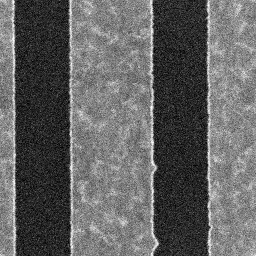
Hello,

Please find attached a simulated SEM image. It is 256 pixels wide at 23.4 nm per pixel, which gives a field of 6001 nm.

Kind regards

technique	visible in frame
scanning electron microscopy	one or a few lines or trenches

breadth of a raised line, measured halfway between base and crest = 1900 nanometers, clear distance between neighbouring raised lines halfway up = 1330 nm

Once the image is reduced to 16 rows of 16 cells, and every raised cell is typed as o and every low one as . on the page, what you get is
o...ooooo....ooo
o...ooooo....ooo
o...ooooo....ooo
o...ooooo....ooo
o...oooooo...ooo
o...oooooo...ooo
o...oooooo...ooo
o...oooooo...ooo
o...oooooo...ooo
o...oooooo...ooo
o...oooooo...ooo
o...oooooo...ooo
o....ooooo...ooo
o...oooooo...ooo
o...oooooo...ooo
o...oooooo...ooo